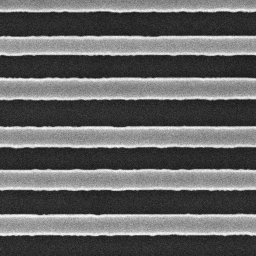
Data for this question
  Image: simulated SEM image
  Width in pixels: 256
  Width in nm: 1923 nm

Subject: lines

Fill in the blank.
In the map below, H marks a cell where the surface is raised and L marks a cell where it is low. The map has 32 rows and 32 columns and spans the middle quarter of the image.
LLLLLLLLLLLLLLLLLLLLLLLLLLLLLLLL
LLLLLLLLLLLLLLLLLLLLLLLLLLLLLLLL
LLLLLLLLLLLLLLLLLLLLLLLLLLLLLLLL
LLLLLLLLLLLLLLLLLLLLLLLLLLLLLLLL
HHHHHHHHHHHHHHHHHHHHHHHHHHHHHHHH
HHHHHHHHHHHHHHHHHHHHHHHHHHHHHHHH
HHHHHHHHHHHHHHHHHHHHHHHHHHHHHHHH
HHHHHHHHHHHHHHHHHHHHHHHHHHHHHHHH
HHHHHHHHHHHHHHHHHHHHHHHHHHHHHHHH
LLLLLLLLLLLLLLLLLLLLLLLLLLLLLLLL
LLLLLLLLLLLLLLLLLLLLLLLLLLLLLLLL
LLLLLLLLLLLLLLLLLLLLLLLLLLLLLLLL
LLLLLLLLLLLLLLLLLLLLLLLLLLLLLLLL
LLLLLLLLLLLLLLLLLLLLLLLLLLLLLLLL
LLLLLLLLLLLLLLLLLLLLLLLLLLLLLLLL
LLLLLLLLLLLLLLLLLLLLLLLLLLLLLLLL
HHHHHHHHHHHHHHHHHHHHHHHHHHHHHHHH
HHHHHHHHHHHHHHHHHHHHHHHHHHHHHHHH
HHHHHHHHHHHHHHHHHHHHHHHHHHHHHHHH
HHHHHHHHHHHHHHHHHHHHHHHHHHHHHHHH
HHHHHHHHHHHHHHHHHHHHHHHHHHHLHHHH
LLLLLLLLLLLLLLLLLLLLLLLLLLLLLLLL
LLLLLLLLLLLLLLLLLLLLLLLLLLLLLLLL
LLLLLLLLLLLLLLLLLLLLLLLLLLLLLLLL
LLLLLLLLLLLLLLLLLLLLLLLLLLLLLLLL
LLLLLLLLLLLLLLLLLLLLLLLLLLLLLLLL
LLLHLLLLHHHHLLLLLLLHHHHHHHLLLHLL
HHHHHHHHHHHHHHHHHHHHHHHHHHHHHHHH
HHHHHHHHHHHHHHHHHHHHHHHHHHHHHHHH
HHHHHHHHHHHHHHHHHHHHHHHHHHHHHHHH
HHHHHHHHHHHHHHHHHHHHHHHHHHHHHHHH
LHHHLHLLLLLHHHHLLLLLLLLLLLLLHLLL